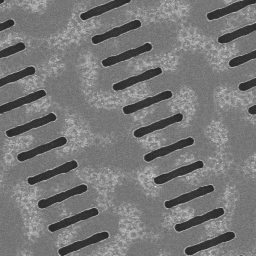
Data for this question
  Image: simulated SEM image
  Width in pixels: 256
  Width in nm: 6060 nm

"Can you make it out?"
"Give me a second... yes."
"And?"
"a regular array of holes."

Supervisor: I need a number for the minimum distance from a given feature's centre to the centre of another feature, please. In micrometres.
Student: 0.605